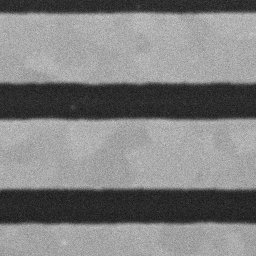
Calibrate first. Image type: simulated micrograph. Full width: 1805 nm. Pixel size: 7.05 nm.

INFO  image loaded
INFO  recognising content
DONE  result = lines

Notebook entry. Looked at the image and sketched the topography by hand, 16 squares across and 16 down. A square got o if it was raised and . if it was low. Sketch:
................
oooooooooooooooo
oooooooooooooooo
oooooooooooooooo
oooooooooooooooo
................
................
.ooo...oooo..ooo
oooooooooooooooo
oooooooooooooooo
oooooooooooooooo
oooooooooooooooo
................
................
oooooooooooooooo
oooooooooooooooo